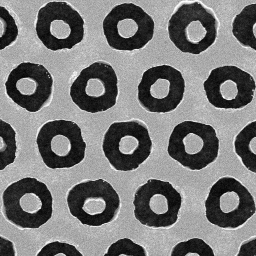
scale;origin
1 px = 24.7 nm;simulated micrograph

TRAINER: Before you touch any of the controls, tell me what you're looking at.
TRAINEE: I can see a regular array of ring-shaped grooves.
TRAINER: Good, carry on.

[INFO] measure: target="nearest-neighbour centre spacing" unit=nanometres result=1600